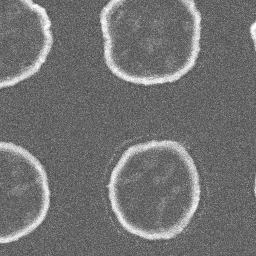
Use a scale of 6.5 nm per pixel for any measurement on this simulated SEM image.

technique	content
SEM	raised bodies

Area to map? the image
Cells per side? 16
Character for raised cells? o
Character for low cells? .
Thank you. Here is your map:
oo.....ooooo....
ooo...oooooo....
ooo....ooooo....
ooo....ooooo....
oo.....oooo.....
................
................
................
................
o.......ooo.....
oo.....ooooo....
ooo....ooooo....
ooo....ooooo....
ooo....ooooo....
oo.......oo.....
................